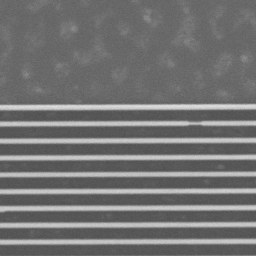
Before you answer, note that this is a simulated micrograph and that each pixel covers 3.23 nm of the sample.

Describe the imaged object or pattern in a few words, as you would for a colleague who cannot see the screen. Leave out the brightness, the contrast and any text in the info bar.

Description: parallel lines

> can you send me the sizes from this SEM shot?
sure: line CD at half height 3.87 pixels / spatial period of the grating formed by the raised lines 54.1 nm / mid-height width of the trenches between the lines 40.7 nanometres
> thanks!